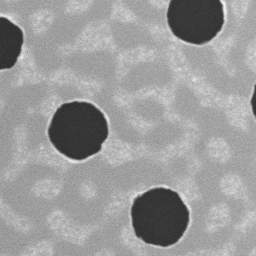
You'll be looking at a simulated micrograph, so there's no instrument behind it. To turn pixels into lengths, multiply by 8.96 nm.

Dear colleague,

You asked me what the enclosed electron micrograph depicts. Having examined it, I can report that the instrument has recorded holes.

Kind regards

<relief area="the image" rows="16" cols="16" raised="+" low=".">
++++++++++....++
.++++++++++...++
.++++++++++..+++
.+++++++++++++++
++++++++++++++++
++++++++++++++++
++++..++++++++++
+++....+++++++++
+++....+++++++++
++++..++++++++++
++++++++++++++++
++++++++++++++++
++++++++...+++++
++++++++....++++
++++++++....++++
++++++++++++++++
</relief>